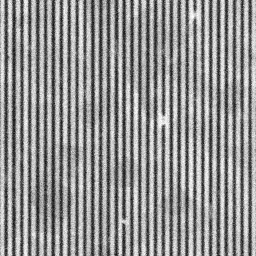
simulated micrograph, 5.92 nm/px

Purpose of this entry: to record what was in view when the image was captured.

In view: parallel lines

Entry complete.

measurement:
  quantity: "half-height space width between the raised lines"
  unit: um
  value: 0.0274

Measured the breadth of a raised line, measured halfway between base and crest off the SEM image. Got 16.3 nanometers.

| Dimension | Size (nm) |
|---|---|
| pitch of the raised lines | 46.5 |